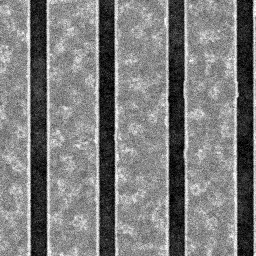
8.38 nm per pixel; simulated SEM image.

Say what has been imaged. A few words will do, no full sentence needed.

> one or a few lines or trenches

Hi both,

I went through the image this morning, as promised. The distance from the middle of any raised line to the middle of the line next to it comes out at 68.9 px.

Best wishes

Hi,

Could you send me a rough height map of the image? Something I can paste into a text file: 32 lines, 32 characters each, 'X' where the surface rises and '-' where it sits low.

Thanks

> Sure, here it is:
XXXX--XXXXXX--XXXXXXX--XXXXXX---
XXXX--XXXXXX--XXXXXXX--XXXXXX---
XXXX--XXXXXX--XXXXXXX--XXXXXX---
XXXX--XXXXXX--XXXXXXX--XXXXXX---
XXXX--XXXXXX--XXXXXXX--XXXXXX---
XXXX--XXXXXX--XXXXXXX--XXXXXX---
XXXX--XXXXXX--XXXXXXX--XXXXXX---
XXXX--XXXXXX--XXXXXXX--XXXXXX---
XXXX--XXXXXX--XXXXXXX--XXXXXX---
XXXX--XXXXXX--XXXXXXX--XXXXXX---
XXXX--XXXXXX--XXXXXXX--XXXXXX---
XXXX--XXXXXX--XXXXXXX--XXXXXXX--
XXXX--XXXXXX--XXXXXXX--XXXXXX---
XXXX--XXXXXX--XXXXXXX--XXXXXX---
XXXX--XXXXXX--XXXXXXX--XXXXXX---
XXXX--XXXXXX--XXXXXXX--XXXXXX---
XXXX--XXXXXX--XXXXXXX--XXXXXX---
XXXX--XXXXXX--XXXXXXX--XXXXXX---
XXXX--XXXXXX--XXXXXXX--XXXXXX---
XXXX--XXXXXX--XXXXXXX--XXXXXX---
XXXX--XXXXXX---XXXXXX--XXXXXX---
XXXX--XXXXXX---XXXXXX--XXXXXX---
XXXX--XXXXXX---XXXXXX--XXXXXX---
XXXX--XXXXXX---XXXXXX--XXXXXX---
XXXX--XXXXXX---XXXXXX--XXXXXX---
XXXX--XXXXXX---XXXXXX--XXXXXX---
XXXX--XXXXXX---XXXXXX--XXXXXX---
XXXX--XXXXXX---XXXXXX--XXXXXX---
XXXX--XXXXXX---XXXXXX--XXXXXX---
XXXX--XXXXXX---XXXXXX--XXXXXX---
XXXX--XXXXXX---XXXXXX--XXXXXX---
XXXX--XXXXXX---XXXXXX--XXXXXX---